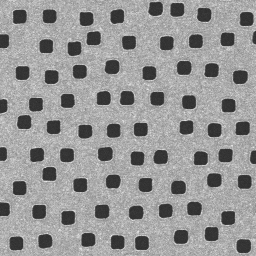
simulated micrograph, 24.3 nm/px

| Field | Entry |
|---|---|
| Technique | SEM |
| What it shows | a regular array of holes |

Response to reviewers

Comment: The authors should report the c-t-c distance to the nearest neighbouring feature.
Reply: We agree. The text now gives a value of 663 nm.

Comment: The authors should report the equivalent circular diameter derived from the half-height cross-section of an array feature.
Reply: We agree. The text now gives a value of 374 nm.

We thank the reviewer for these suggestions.